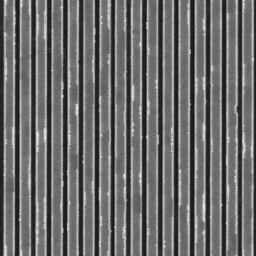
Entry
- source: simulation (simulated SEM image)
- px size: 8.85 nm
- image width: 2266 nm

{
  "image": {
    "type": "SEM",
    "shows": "parallel lines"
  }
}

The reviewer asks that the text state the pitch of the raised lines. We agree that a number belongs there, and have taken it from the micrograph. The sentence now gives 0.141 micrometres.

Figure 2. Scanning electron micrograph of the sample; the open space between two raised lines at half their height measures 0.0431 micrometres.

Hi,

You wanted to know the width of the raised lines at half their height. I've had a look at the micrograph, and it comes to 94 nanometers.